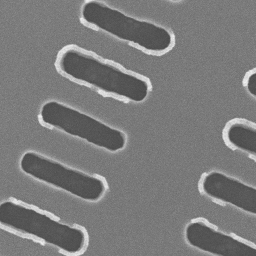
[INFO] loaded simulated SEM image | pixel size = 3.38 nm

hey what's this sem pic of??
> holes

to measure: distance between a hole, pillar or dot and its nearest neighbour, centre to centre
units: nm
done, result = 183